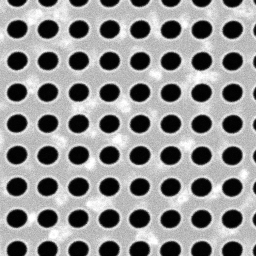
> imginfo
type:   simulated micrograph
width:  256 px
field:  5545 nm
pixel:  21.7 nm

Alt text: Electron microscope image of a regular array of holes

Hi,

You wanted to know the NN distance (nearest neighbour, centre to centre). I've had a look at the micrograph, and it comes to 0.665 micrometres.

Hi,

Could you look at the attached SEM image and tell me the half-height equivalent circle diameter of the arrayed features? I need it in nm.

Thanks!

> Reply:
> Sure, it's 433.